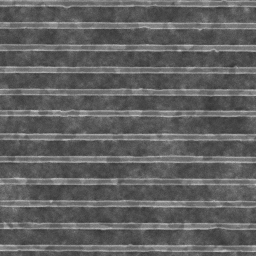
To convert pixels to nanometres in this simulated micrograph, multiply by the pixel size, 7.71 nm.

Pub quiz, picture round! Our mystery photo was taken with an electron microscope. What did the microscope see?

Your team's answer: parallel lines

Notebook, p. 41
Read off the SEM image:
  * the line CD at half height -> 0.0434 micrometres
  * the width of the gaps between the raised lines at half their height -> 128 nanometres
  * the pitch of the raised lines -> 172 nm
